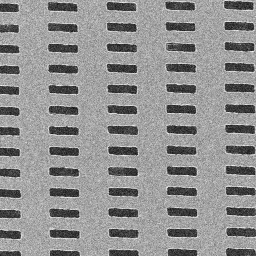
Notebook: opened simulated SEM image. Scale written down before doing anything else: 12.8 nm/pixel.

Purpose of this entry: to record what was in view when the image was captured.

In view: a regular array of holes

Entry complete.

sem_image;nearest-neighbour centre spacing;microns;0.263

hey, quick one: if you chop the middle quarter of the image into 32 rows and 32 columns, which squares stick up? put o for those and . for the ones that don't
...oooooooo.......ooooooo.......
....ooooooo.......oooooooo......
...ooooooooooooooooooooooooooooo
oooooooooooooooooooooooooooooooo
oooooooooooooooooooooooooooooooo
...oooooooo.......ooooooo.......
....ooooooo.......oooooooo......
....ooooooooooo...oooooooooooooo
oooooooooooooooooooooooooooooooo
oooooooooooooooooooooooooooooooo
..ooooooooo.......oooooooo......
....ooooooo.......oooooooo......
....ooooooooo.....oooooooooooo..
oooooooooooooooooooooooooooooooo
oooooooooooooooooooooooooooooooo
ooooooooooo.......oooooooo......
....ooooooo........ooooooo......
....oooooooo......oooooooooo....
oooooooooooooooooooooooooooooooo
oooooooooooooooooooooooooooooooo
ooooooooooo...oooooooooooo.....o
....ooooooo........oooooo.......
....ooooooo........ooooooo......
oooooooooooooooooooooooooooooooo
oooooooooooooooooooooooooooooooo
oooooooooooooooooooooooooo.ooooo
....ooooooo.......oooooooo......
....ooooooo........ooooooo......
oooooooooooooooooooooooooooooooo
oooooooooooooooooooooooooooooooo
oooooooooooooooooooooooooooooooo
....ooooooo.......oooooooo......